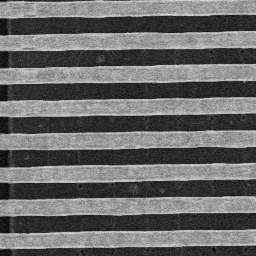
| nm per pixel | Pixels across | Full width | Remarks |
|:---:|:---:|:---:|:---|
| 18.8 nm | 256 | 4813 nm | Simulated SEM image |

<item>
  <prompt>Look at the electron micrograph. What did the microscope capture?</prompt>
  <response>wiring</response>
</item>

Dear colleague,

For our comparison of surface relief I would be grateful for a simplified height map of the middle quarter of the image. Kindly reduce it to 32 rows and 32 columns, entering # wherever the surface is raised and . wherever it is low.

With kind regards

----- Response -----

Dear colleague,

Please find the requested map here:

...............................#
################################
################################
################################
##############..###.....#.......
................................
................................
................................
................................
################################
################################
################################
#########################.......
................................
................................
................................
................................
##.#############################
################################
################################
################################
................................
................................
................................
................................
.....######....#################
################################
################################
################################
................................
................................
................................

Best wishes